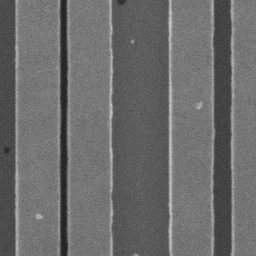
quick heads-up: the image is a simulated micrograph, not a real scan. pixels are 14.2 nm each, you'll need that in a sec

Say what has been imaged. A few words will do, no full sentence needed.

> lines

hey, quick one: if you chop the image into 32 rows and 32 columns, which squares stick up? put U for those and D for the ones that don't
DDUUUUUDUUUUUUDDDDDDDUUUUUUDDUUU
DDUUUUUDUUUUUUDDDDDDDUUUUUUDDUUU
DDUUUUUDUUUUUUDDDDDDDUUUUUUDDUUU
DDUUUUUDUUUUUUDDDDDDDUUUUUUDDUUU
DDUUUUUDUUUUUUDDDDDDDUUUUUUDDUUU
DDUUUUUDDUUUUUDDDDDDDUUUUUUDDUUU
DDUUUUUDDUUUUUDDDDDDDUUUUUUDDUUU
DDUUUUUDDUUUUUDDDDDDDUUUUUUDDUUU
DDUUUUUDDUUUUUDDDDDDDUUUUUUDDUUU
DDUUUUUDDUUUUUDDDDDDDUUUUUUDDUUU
DDUUUUUDDUUUUUDDDDDDDUUUUUUDDUUU
DDUUUUUDDUUUUUDDDDDDDUUUUUUDDUUU
DDUUUUUDDUUUUUDDDDDDDUUUUUUDDUUU
DDUUUUUDDUUUUUDDDDDDDUUUUUUDDUUU
DDUUUUUDDUUUUUDDDDDDDUUUUUUDDUUU
DDUUUUUDDUUUUUDDDDDDDUUUUUUDDUUU
DDUUUUUDUUUUUUDDDDDDDUUUUUUDDUUU
DDUUUUUDDUUUUUDDDDDDDUUUUUUDDUUU
DDUUUUUDDUUUUUDDDDDDDUUUUUUDDUUU
DDUUUUUDDUUUUUDDDDDDDUUUUUUDDUUU
DDUUUUUDDUUUUUDDDDDDDUUUUUUDDUUU
DDUUUUUDDUUUUUDDDDDDDUUUUUUDDUUU
DDUUUUUDDUUUUUDDDDDDDUUUUUUDDUUU
DDUUUUUDDUUUUUDDDDDDDUUUUUUDDUUU
DDUUUUUDDUUUUUDDDDDDDUUUUUUDDUUU
DDUUUUUDDUUUUUDDDDDDDUUUUUUDDUUU
DDUUUUUDDUUUUUDDDDDDDUUUUUUDDUUU
DDUUUUUDDUUUUUDDDDDDDUUUUUUDDUUU
DDUUUUUDDUUUUUDDDDDDDUUUUUUDDUUU
DDUUUUUDDUUUUUDDDDDDDUUUUUUDDUUU
DDUUUUUDDUUUUUDDDDDDDUUUUUUDDUUU
DDUUUUUDDUUUUUDDDDDDDUUUUUUDDUUU